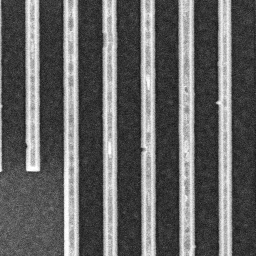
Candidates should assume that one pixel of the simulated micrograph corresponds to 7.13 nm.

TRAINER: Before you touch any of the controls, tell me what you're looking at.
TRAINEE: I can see parallel lines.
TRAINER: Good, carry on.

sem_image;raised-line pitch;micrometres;0.274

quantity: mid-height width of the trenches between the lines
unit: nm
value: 199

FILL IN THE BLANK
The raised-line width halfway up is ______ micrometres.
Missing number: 0.0731